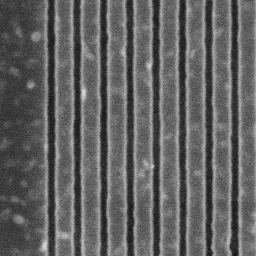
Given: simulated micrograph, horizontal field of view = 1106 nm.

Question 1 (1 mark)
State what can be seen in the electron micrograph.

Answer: parallel lines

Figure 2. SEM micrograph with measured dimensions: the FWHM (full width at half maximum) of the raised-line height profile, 80.5 nanometers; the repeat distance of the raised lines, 114 nanometers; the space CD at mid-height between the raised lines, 34.1 nanometres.